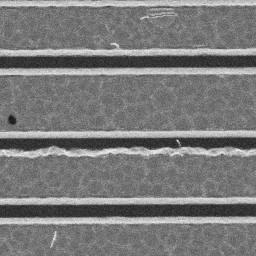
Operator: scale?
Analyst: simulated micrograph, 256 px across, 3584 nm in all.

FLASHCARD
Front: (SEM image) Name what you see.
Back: one or a few lines or trenches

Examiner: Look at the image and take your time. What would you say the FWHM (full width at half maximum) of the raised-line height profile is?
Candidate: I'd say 280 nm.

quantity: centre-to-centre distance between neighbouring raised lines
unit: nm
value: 1040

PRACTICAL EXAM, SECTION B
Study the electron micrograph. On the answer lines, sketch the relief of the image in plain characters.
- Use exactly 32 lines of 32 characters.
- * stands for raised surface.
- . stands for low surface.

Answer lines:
....**.*..***...................
................................
................................
................................
................................
................................
......*****.*.*...****..***..***
********************************
********************************
................................
................................
................................
................................
................................
................................
................................
................................
********************************
********************************
................................
................................
................................
................................
................................
................................
********************************
********************************
**************.*****************
................................
................................
................................
................................